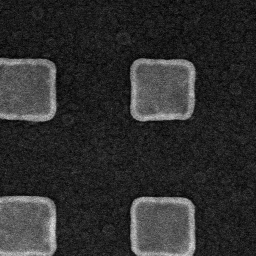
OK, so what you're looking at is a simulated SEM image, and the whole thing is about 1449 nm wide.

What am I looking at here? raised bodies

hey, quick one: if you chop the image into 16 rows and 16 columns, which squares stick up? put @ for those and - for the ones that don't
----------------
----------------
----------------
----------------
@@@-----@@@@----
@@@-----@@@@----
@@@-----@@@@----
----------------
----------------
----------------
----------------
----------------
@@@------@@-----
@@@-----@@@@----
@@@-----@@@@----
@@@-----@@@@----